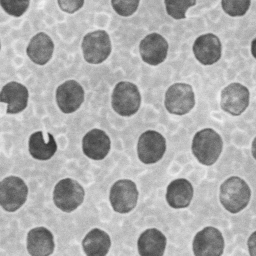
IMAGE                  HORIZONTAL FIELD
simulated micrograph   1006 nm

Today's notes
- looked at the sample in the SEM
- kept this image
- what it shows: a regular array of holes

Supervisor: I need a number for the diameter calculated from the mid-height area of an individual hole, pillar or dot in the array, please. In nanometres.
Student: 126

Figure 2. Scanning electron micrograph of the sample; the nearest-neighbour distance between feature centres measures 215 nm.